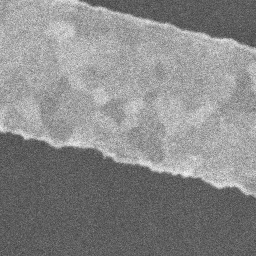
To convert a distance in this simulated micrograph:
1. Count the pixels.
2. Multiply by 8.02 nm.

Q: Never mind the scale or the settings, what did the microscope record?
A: one or a few lines or trenches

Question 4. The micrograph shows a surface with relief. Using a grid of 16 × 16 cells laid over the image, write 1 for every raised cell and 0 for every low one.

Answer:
1111110000000000
1111111111000000
1111111111111100
1111111111111111
1111111111111111
1111111111111111
1111111111111111
1111111111111111
0011111111111111
0000000111111111
0000000000111111
0000000000000111
0000000000000000
0000000000000000
0000000000000000
0000000000000000